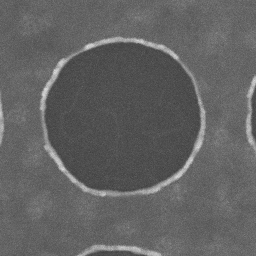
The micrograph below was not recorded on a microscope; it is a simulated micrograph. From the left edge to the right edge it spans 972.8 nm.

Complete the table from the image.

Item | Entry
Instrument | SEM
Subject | holes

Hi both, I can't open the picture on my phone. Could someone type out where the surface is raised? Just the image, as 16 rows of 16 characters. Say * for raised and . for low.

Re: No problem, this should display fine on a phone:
****************
****************
****************
*****......*****
****........****
***.........****
***.........****
***..........***
***.........****
***.........****
****.......*****
*****.....******
****************
****************
****************
****************